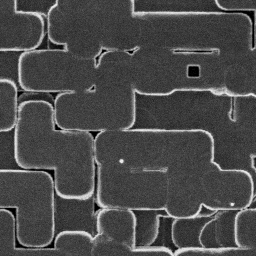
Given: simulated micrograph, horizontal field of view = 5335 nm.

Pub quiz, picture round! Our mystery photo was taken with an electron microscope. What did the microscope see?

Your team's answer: wiring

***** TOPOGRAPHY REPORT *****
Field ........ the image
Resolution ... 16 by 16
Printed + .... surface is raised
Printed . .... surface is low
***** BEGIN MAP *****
+..+++++......++
++++++++++++++++
++++++++++++++++
.+++++++++++++++
.+++++++++++++++
+.++++++++++++++
++++++++........
++++++++........
.++++++++++++...
.++++++++++++...
.+++++++++++++..
++++++++++++++++
+++...++++++++++
+++...++...+...+
++++..++.......+
+++++++++.....++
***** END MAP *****